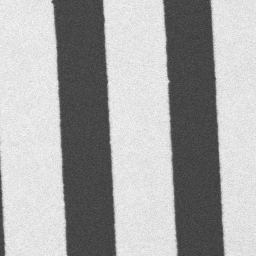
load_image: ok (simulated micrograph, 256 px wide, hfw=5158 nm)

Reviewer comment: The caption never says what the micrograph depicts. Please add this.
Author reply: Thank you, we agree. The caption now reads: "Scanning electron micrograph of one or a few lines or trenches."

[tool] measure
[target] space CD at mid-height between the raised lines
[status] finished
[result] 1200 nm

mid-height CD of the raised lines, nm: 1000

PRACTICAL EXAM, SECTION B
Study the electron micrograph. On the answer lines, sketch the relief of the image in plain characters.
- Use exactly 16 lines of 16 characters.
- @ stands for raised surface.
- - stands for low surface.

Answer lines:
---@@@@---@@@---
---@@@@---@@@---
---@@@@---@@@---
----@@@---@@@---
----@@@---@@@---
----@@@---@@@@--
----@@@----@@@--
----@@@----@@@--
----@@@----@@@--
----@@@----@@@--
----@@@----@@@--
----@@@----@@@--
----@@@----@@@--
----@@@----@@@--
----@@@----@@@--
----@@@----@@@--